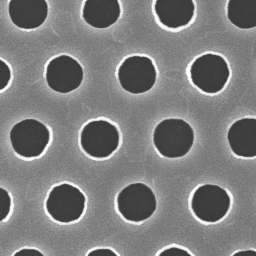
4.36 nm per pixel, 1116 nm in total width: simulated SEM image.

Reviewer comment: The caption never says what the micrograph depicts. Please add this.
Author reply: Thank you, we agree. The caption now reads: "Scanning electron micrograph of a regular array of holes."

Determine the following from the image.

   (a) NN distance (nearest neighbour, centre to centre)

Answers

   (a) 314 nanometers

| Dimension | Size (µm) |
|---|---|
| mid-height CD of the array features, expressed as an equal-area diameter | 0.166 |